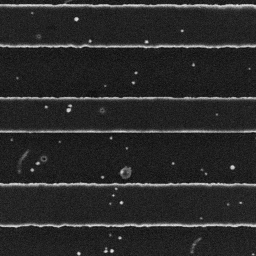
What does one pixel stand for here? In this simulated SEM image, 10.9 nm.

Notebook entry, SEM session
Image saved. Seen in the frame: lines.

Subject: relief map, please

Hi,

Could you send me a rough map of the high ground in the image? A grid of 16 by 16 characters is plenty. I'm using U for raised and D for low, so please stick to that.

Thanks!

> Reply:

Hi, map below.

UUUUUUUUUUUUUUUU
UUUUUUUUUUUUUUUU
UUUUUUUUUUUUUUUU
DDDDDDDDDDDDDDDD
DDDDDDDDDDDDDDDD
DDDDDDDDDDDDDDDD
UUUUUUUUUUUUUUUU
UUUUUUUUUUUUUUUU
DDDDDDDDDDDDDDDD
DDDDDDDDDDDDDDDD
DDDDDDDDDDDDDDDD
UUUUUUDUUDUUUUUU
UUUUUUUUUUUUUUUU
UUUUUUUUUUUUUUUU
DDDDDDDDDDDDDDDD
DDDDDDDDDDDDDDDD